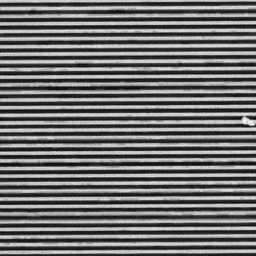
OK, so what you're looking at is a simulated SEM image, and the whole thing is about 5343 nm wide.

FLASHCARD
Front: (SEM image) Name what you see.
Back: parallel lines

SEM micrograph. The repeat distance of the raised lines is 159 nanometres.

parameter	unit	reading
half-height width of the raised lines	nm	62.6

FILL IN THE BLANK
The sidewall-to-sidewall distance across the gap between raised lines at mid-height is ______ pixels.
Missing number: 4